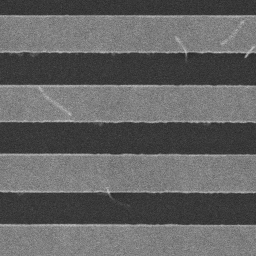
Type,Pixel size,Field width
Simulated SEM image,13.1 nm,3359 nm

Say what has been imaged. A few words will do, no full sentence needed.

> lines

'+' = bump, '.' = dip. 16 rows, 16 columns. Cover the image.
................
++++++++++++++++
++++++++++++++++
................
................
++++++++++++++++
++++++++++++++++
++++++++++++++++
................
................
++++++++++++++++
++++++++++++++++
................
................
++++++++++++++++
++++++++++++++++